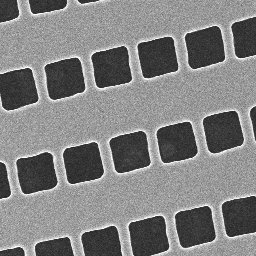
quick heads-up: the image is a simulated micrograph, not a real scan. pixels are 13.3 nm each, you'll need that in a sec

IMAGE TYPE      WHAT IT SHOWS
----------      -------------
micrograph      a regular array of holes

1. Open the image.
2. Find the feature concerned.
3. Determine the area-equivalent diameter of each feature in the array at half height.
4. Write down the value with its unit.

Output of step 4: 0.548 micrometres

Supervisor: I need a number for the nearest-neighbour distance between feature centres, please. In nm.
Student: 632